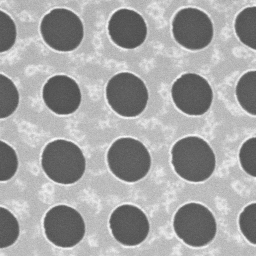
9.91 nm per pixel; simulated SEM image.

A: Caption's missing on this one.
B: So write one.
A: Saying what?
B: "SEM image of a regular array of holes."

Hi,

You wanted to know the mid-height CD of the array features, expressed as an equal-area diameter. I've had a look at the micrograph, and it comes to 426 nm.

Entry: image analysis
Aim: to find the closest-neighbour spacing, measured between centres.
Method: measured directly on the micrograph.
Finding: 643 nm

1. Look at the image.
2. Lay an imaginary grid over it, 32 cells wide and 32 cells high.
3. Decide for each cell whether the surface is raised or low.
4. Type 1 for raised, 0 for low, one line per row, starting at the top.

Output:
11111111111111111111111111111111
11111100011111000111110001111100
00111000001111000011110000111000
00111000001111000011100000011000
00111000001111000011110000011100
00111100001111100011110000111100
11111111111111111111111111111111
11111111111111111111111111111111
11111111111111111111111111111111
01111110111111000111111001111100
00111100001110000011110000111100
00111000001110000011100000011000
00111000001110000011110000011100
00111100001111000011110000111100
01111111111111100111111101111111
11111111111111111111111111111111
11111111111111111111111111111111
11111110111111000111110001111110
00111100001111000011110000111100
00111000001110000001100000011100
00111000000110000001110000011100
00111100000111000001110000011110
01111100001111100111111000111111
11111111111111111111111111111111
11111111111111111111111111111111
11111111111111111111111001111110
01111100001111000011110000111100
00111100001111000001110000011100
00111100000111000001110000011100
00111100001111000011110000011110
00111110001111100111111000111111
11111111111111111111111111111111